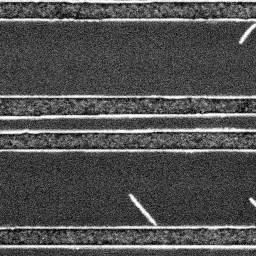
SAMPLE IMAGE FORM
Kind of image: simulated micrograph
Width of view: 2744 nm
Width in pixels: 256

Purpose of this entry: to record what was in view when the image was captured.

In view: lines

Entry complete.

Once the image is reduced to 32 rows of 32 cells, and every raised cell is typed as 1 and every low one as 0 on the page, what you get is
00000000000000000000000000000000
00000000000000000000000000000000
11111100000001111111111100001000
11111111111111111111111111111111
11111111111111111111111111111111
11111111111111111111111111111111
11111111111111111111111111111111
11111111111111111111111111111111
11111111111111111111111111111111
11111111111111111111111111111111
11111111111111111111111111111111
11111111111111111111111111111111
00000000000000000000000000000000
00000000000000000000000000000000
00000000000000000011111111111111
11111111111111111111111111111111
10000000000000000000000000000000
00000000000000000000000000000000
00000000000000000000000000000000
11111111111111111111111111111111
11111111111111111111111111111111
11111111111111111111111111111111
11111111111111111111111111111111
11111111111111111111111111111111
11111111111111111111111111111111
11111111111111111111111111111111
11111111111111111111111111111111
11111111111111111111111111111111
10000000000000000000000000000000
00000000000000000000000000000000
00000000000000000000000000000000
11111111111111111111111111111111